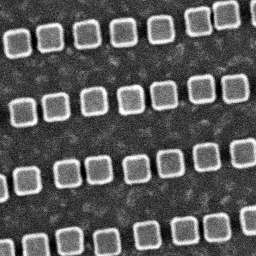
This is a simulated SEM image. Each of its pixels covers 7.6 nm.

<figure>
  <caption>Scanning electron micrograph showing a regular array of raised bodies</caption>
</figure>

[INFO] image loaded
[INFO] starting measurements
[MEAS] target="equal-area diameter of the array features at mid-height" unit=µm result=0.214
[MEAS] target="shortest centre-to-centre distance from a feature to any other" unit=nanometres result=252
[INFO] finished